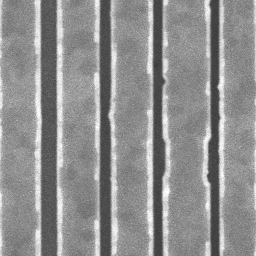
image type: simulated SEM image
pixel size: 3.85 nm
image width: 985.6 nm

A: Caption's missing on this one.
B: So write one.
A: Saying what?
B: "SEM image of parallel lines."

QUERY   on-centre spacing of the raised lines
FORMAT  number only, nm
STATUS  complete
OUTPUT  209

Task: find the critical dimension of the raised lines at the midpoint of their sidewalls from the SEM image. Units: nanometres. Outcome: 162